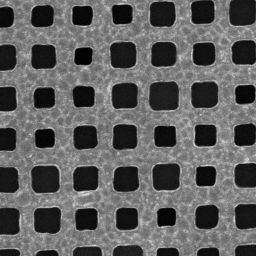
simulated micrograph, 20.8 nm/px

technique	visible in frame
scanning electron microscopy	a regular array of holes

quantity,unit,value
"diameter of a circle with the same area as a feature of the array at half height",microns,0.54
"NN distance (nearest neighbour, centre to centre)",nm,826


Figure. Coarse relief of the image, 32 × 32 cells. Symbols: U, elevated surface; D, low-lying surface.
UUUUUUUUUUUUUUUUUUUDDDUUDDDUUDDD
DDUUDDDUUDDDUUDDDUUDDDUUDDDUUDDD
DDUUDDDUUDDUUUDDUUUDDDUUDDDUUDDD
UUUUUUUUUUUUUUUUUUUUUUUUUUUUUUUU
UUUUUUUUUUUUUUUUUUUUUUUUUUUUUUUU
UUUUUUUUUUUUUUDDDUUDDDUUDDDUUDDD
DDUUDDDUUDDDUUDDDUUDDDUUDDDUUDDD
DDUUDDDUUDDUUUDDDUUDDDUUDDDUUDDD
DDUUDDDUUUUUUUUDUUUUUUUUUUUUUUUU
UUUUUUUUUUUUUUUUUUUUUUUUUUUUUUUU
UUUUUUUUUUUUUUUDDUUDDDUUDDDUUUUU
DDUUDDDUUDDDUUDDDUUDDDUUDDDUUDDD
DDUUDDDUUDDDUUDDDUUDDDUUDDDUUDDD
DDUUUDUUUUUUUUDDDUUDDDUUDDUUUUUU
UUUUUUUUUUUUUUUUUUUUUUUUUUUUUUUU
UUUUUUUUUUUUUUUDUUUUUUUUUUUUUUUD
DDUUUDDUUDDDUUDDDUUDDDUUDDDUUDDD
DDUUDDDUUDDDUUDDDUUDDDUUDDDUUDDD
DDUUUDUUUDDDUUDDDUUUUUUUUUUUUUUU
UUUUUUUUUUUUUUUUUUUUUUUUUUUUUUUU
UUUUUUUUUUUUUUUUUUUUDDUUUUUUUUDD
DDUUDDDUUDDDUUDDDUUDDDDUDDDUUDDD
DDUUDDDDUDDDUUDDDUUDDDUUDDDUUDDD
DDUUDDDUUDDDUUDDDUUDDDUUUUUUUUDU
UUUUUUUUUUUUUUUUUUUUUUUUUUUUUUUU
UUUUUUUUUUUUUUUUUUUUUUUUUUUUUUDD
DDUUDDDDUDDDUUUDDUUUDDUUDDDUUDDD
DDUUDDDDUDDDUUDDDUUUDDUUDDDUUDDD
DDUUDDDDUUDDUUUDDUUUUUUUUDDUUUDD
UUUUUUUUUUUUUUUUUUUUUUUUUUUUUUUU
UUUUUUUUUUUUUUUUUUUUUUUUUUUUUUUU
DDUUUDDUUDDDDUDDDDUUDDUUUDDUUDDD